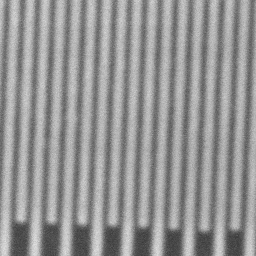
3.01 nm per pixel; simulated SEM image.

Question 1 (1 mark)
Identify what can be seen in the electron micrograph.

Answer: parallel lines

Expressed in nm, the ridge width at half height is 28.6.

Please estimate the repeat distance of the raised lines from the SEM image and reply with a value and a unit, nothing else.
46.1 nm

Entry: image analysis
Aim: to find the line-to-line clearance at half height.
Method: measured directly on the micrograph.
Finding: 0.0173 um